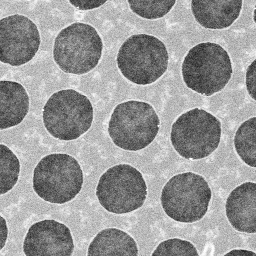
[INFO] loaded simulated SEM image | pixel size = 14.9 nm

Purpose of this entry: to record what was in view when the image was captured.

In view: a regular array of holes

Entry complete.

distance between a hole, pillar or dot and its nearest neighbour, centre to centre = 957 nm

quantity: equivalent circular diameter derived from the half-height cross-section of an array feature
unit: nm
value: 761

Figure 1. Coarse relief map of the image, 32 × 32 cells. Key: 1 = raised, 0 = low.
11111111100001110000001100000011
11111111111111111000011100000011
00001111111111111111111100000111
00000111000011111111111111001111
00000110000011110001111111111111
00000110000001100000111110011111
00000110000001100000011100001111
00001110000011100000011000000111
11111110000011100000011000000110
11111111111111100000111000000110
00011111111111111011111000001110
00011110001111111111111110011110
00001100000111111111111111111111
00001000000011000001111111111111
00011000000011000000110000011111
00111000000111000000110000001100
11111100000111000000100000001100
11111110011111000001100000001000
01111111111111100011110000011000
00111100011111111111111000111100
00111000001111101111111111111110
00110000001110000111111111111111
00110000001100000011100000111111
00110000001100000011000000111000
11111000001100000011000000111000
11111110111110000011000000110000
11111111111111001111100000110000
01111101111111111111110001111000
01110000011111111111111111111000
01100000011100001111111111111111
01100000011000000111000011111111
11100000011000000110000001111000